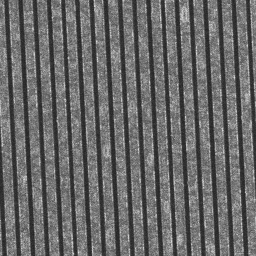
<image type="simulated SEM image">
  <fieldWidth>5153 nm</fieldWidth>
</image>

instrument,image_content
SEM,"parallel lines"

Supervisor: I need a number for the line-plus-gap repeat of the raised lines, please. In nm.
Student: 285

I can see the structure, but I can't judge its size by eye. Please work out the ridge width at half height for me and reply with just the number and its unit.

198 nm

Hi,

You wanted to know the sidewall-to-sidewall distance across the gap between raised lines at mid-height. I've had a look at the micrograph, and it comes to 90.5 nanometers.